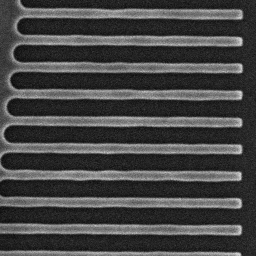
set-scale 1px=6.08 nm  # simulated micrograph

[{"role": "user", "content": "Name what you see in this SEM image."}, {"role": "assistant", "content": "groups of lines, slits or small figures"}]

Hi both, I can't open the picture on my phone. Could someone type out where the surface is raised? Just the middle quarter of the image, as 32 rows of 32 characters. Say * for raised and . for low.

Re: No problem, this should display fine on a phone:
********************************
********************************
................................
................................
................................
................................
................................
********************************
********************************
................................
................................
................................
................................
************************...*****
********************************
...........*******...***********
................................
................................
................................
................................
********************************
********************************
................................
................................
................................
................................
................................
********************************
********************************
................................
................................
................................